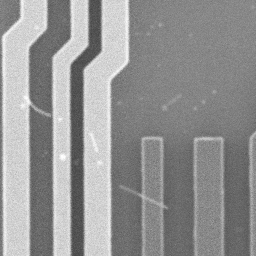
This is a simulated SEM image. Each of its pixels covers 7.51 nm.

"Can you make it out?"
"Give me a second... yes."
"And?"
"groups of lines, slits or small figures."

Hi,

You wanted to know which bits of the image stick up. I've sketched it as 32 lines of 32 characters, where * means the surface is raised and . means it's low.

...***...**..***................
...***...**..***................
..****...**..***................
..****...**..***................
.****....**..***................
****....***..***................
***....***...***................
***....**...****................
***....**..****.................
***....**..***..................
***....**..***..................
***....**..***..................
****...**..***..................
****...**..***..................
***....**..***..................
***....**..***..................
***....**..***..................
***....**..***....**.....***...*
***....**..***....**....****...*
****...**..***....**....****...*
****...**..***....**....****...*
****...**..***....**....****...*
****...**..***....**....****...*
.***...**..***....**....****...*
.***...**..***....**....****...*
.***...**..***....**....****...*
.***...**..***....**....****...*
.***...**..***....**....****...*
.***...**..***....**....****...*
.***...**..***....**....****...*
.***...**..***....**....****...*
.***...**..***....**....****...*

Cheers